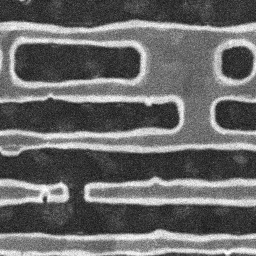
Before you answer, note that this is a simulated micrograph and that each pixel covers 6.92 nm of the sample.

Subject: parallel lines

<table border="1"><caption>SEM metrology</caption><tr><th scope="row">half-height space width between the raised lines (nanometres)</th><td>247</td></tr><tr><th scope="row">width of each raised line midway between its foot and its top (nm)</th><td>121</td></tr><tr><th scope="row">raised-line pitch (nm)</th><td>362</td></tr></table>